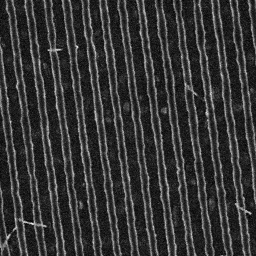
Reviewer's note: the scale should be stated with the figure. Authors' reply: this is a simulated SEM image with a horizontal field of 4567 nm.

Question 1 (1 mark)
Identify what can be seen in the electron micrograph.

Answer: parallel lines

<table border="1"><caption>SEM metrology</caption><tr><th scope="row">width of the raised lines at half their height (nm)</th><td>135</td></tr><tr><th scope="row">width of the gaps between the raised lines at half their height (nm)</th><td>197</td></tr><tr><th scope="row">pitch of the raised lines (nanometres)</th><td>330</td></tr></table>